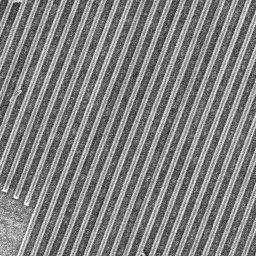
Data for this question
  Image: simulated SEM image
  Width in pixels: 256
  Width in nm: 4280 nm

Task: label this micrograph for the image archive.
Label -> parallel lines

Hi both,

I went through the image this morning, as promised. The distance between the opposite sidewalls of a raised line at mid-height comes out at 0.0644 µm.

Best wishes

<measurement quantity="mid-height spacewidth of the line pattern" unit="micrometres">0.146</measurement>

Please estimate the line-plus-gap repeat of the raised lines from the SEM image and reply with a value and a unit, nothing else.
206 nm